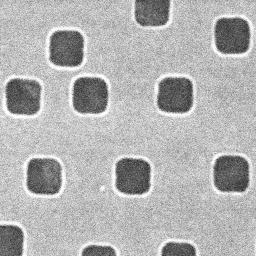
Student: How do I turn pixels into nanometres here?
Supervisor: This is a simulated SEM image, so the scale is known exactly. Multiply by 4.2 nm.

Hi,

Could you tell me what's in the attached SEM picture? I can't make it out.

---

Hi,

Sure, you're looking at a regular array of holes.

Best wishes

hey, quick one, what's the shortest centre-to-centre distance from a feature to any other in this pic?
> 0.345 microns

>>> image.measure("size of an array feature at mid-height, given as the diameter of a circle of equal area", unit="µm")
0.172